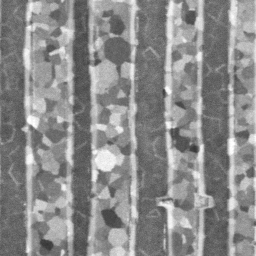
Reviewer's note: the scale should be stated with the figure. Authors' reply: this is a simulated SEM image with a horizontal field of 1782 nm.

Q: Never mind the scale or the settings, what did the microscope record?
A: one or a few lines or trenches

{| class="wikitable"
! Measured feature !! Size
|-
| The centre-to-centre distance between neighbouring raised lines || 472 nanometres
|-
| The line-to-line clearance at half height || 224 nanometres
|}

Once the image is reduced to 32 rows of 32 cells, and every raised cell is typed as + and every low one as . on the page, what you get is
....+++++...+++++....++++....+++
....+++++...+++++....++++....+++
....+++++...+++++....++++....+++
....+++++..+++++.....++++....+++
....+++++..+++++.....++++....+++
....+++++..++++++....++++....+++
....+++++..++++++....++++....+++
....+++++...+++++....++++....+++
....+++++...+++++....++++....+++
...++++++...+++++....++++....+++
...++++++...++++.....++++....+++
...++++++...++++.....++++....+++
....+++++...++++.....++++....+++
....+++++...+++++....++++....+++
....+++++...+++++....++++....+++
...++++++...++++.....++++....+++
...++++++...++++.....++++....+++
....+++++...++++.....++++....+++
....+++++...+++++....++++....+++
....+++++...+++++....++++....+++
....+++++...+++++....++++....+++
....+++++...+++++....++++....+++
....++++....+++++....++++....+++
....+++++...+++++....++++....+++
....+++++...+++++....+++++...+++
....+++++...+++++...++++++...+++
....+++++...+++++....++++....+++
....+++++...+++++....++++....+++
....+++++...+++++....++++....+++
....+++++...++++.....++++....+++
....+++++..+++++.....++++....+++
....+++++..+++++.....++++....+++